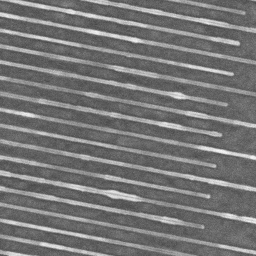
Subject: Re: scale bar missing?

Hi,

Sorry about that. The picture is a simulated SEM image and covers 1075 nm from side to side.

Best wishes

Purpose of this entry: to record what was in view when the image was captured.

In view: parallel lines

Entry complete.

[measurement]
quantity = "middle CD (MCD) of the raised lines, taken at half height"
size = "13.4 nm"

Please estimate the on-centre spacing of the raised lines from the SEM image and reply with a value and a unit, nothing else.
65.3 nanometres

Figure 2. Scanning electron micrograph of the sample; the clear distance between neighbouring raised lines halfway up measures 0.051 microns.